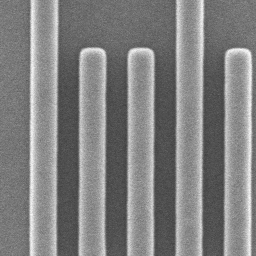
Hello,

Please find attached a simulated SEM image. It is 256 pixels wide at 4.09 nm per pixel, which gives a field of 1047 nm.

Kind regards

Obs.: groups of lines, slits or small figures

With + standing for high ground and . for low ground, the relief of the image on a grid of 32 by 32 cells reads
....+++...............+++.......
....+++...............+++.......
....+++...............+++.......
....+++...............+++.......
....+++...............+++.......
....+++...............+++.......
....+++...+++...+++...+++...+++.
....+++...+++...+++...+++...+++.
....+++...+++...+++...+++...+++.
....+++...+++...+++...+++...+++.
....+++...+++...+++...+++...+++.
....+++...+++...+++...+++...+++.
....+++...+++...+++...+++...+++.
....+++...+++...+++...+++...+++.
....+++...+++...+++...+++...+++.
....+++...+++...+++...+++...+++.
....+++...+++...+++...+++...+++.
....+++...+++...+++...+++...+++.
....+++...+++...+++...+++...+++.
....+++...+++...+++...+++...+++.
....+++...+++...+++...+++...+++.
....+++...+++...+++...+++...+++.
....+++...+++...+++...+++...+++.
....+++...+++...+++...+++...+++.
....+++...+++...+++...+++...+++.
....+++...+++...+++...+++...+++.
....+++...+++...+++...+++...+++.
....+++...+++...+++...+++...+++.
....+++...+++...+++...+++...+++.
....+++...+++...+++...+++...+++.
....+++...+++...+++...+++...+++.
....+++...+++...+++...+++...+++.